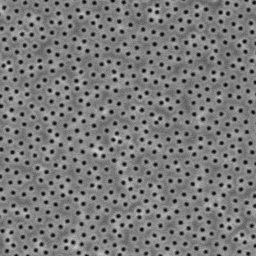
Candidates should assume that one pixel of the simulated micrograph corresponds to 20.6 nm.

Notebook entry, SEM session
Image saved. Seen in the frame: a regular array of holes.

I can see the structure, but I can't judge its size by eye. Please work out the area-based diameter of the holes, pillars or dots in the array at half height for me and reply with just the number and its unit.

4.65 px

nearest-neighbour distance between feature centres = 192 nm